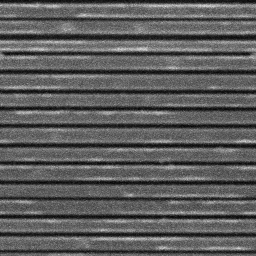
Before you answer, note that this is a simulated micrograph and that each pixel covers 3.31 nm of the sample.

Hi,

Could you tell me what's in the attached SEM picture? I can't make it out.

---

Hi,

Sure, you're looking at parallel lines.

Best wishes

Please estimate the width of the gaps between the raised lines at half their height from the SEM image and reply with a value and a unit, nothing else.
15.7 nm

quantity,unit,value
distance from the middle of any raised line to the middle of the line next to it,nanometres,59.3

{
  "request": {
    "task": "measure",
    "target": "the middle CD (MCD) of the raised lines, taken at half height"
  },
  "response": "44.3 nm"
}